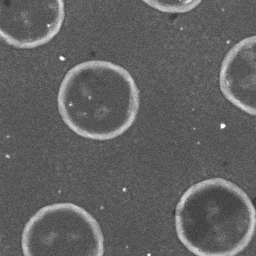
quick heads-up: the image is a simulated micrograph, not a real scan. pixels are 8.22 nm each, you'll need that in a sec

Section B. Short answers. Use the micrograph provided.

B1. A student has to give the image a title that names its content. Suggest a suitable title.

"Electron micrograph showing raised bodies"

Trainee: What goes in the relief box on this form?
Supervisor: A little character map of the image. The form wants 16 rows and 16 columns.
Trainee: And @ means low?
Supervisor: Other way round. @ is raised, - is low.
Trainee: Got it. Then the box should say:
@@@@------@@----
@@@@------------
-@@-------------
--------------@@
-----@@@------@@
----@@@@------@@
----@@@@-------@
----@@@@--------
------@---------
----------------
----------------
-------------@--
-----------@@@@-
--@@@------@@@@@
--@@@@-----@@@@@
--@@@@------@@@-